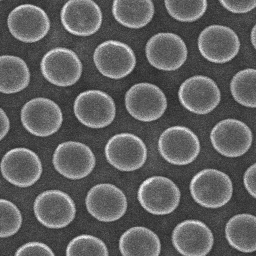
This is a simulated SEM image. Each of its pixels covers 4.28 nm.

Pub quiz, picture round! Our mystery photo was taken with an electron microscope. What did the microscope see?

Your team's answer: a regular array of raised bodies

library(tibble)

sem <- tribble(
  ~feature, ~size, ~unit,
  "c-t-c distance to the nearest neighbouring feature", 226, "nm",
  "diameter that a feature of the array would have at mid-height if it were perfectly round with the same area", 169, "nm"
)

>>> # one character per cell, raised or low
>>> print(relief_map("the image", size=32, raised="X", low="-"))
--------XXXX--XXXXX--XXXXX--XXXX
-XXXXX--XXXXX-XXXXX--XXXXX---XX-
-XXXXX--XXXXX--XXXX---XX--------
-XXXXX--XXXX--------------XX----
--XXX--------------XXX---XXXXX-X
-------------XX---XXXXX--XXXXX--
------XXX---XXXXX-XXXXX--XXXXX--
XXX--XXXXX--XXXXX--XXXX---XXX---
XXX--XXXXX--XXXXX---XX----------
XXXX--XXXX---XXX-------------XXX
XXX----XX--------XX----XXXX--XXX
XX---------XX---XXXX--XXXXX--XXX
----XX---XXXXX--XXXXX-XXXXX---XX
---XXXX--XXXXX--XXXXX--XXXX-----
X--XXXXX--XXXX---XXX------------
X--XXXXX--XXXX-------------XXXX-
X---XXX--------------XXX--XXXXX-
--------------XXXX--XXXXX-XXXXX-
-------XXXX--XXXXX--XXXXX--XXXX-
-XXXX--XXXXX-XXXXX--XXXXX---XX--
XXXXX--XXXXX--XXXX----X---------
XXXXX--XXXX--------------XXX---X
-XXXX-------------XXX---XXXXX--X
------------XXX--XXXXX--XXXXX--X
-----XXX---XXXXX-XXXXX--XXXXX---
XX--XXXXX--XXXXX--XXXX---XXX----
XX--XXXXX--XXXXX---XX-----------
XXX--XXXX---XX---------------XXX
XX---------------X----XXXX--XXXX
X---------X----XXXXX--XXXX--XXXX
---XX----XXXX--XXXXX--XXXXX--XXX
--XXXXX-XXXXX--XXXXX--XXXX------